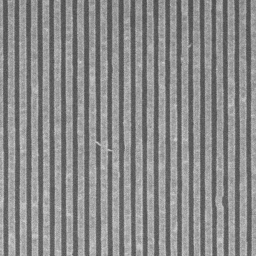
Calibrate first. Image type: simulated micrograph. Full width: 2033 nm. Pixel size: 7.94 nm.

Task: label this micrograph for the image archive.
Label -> parallel lines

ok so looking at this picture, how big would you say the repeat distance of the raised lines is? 91.9 nanometres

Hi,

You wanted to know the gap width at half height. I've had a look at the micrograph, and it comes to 0.0437 µm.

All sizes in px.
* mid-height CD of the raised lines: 6.12